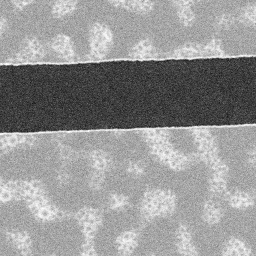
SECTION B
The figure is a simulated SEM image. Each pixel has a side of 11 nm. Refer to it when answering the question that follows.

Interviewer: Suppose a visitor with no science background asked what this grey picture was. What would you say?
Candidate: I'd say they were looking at one or a few lines or trenches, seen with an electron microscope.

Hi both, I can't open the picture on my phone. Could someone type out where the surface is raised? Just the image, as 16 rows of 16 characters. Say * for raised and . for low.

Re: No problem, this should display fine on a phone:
****************
****************
****************
****************
................
................
................
................
****************
****************
****************
****************
****************
****************
****************
****************